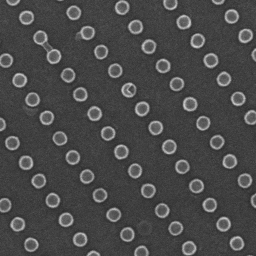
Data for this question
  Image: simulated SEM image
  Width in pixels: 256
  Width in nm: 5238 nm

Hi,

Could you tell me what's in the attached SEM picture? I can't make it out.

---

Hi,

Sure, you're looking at a regular array of raised bodies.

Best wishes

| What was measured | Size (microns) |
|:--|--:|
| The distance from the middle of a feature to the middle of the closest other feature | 0.478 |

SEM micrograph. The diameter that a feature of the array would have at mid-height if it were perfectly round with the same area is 276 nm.